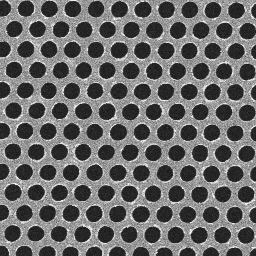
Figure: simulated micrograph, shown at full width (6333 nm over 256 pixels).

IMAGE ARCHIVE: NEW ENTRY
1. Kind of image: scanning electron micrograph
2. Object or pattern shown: a regular array of holes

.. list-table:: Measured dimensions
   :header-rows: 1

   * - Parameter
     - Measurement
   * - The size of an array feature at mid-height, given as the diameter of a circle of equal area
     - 0.412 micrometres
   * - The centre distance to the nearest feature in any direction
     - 573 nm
